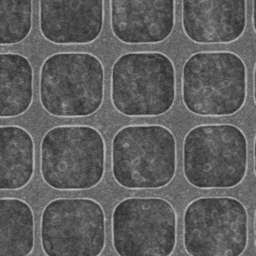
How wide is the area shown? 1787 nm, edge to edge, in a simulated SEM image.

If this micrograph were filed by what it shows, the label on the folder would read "holes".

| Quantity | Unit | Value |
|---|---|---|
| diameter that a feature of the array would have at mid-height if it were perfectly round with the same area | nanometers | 469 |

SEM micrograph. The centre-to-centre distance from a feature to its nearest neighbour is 71.2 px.